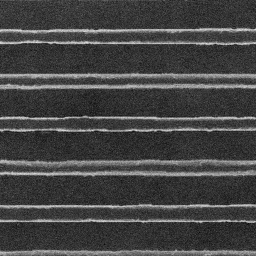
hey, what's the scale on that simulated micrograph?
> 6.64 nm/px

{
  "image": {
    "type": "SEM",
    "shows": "lines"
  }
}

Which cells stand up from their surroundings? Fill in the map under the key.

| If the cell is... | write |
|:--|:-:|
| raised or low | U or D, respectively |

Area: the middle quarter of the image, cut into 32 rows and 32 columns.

DDDDDDDDDDDDDDDDDDDDDDDDDDDDDDDD
DDDDDDDDDDDDDDDDDDDDDDDDDDDDDDDD
DDDDDDDDDDDDDDDDDDDDDDDDDDDDDDDD
UUUUUUUUUUUUUUUUUUUUUUUUUUUUUUUU
UUUUUUUUUUUUUUUUUUUUUUUUUUUUUUUU
UUUUUUUUUUUUUUUUUUUUUUUUUUUUUUUU
DDDDDDDDDDDDDDDDDDDDDDDDDDDDDDDD
DDDDDDDDDDDDDDDDDDDDDDDDDDDDDDDD
DDDDDDDDDDDDDDDDDDDDDDDDDDDDDDDD
DDDDDDDDDDDDDDDDDDDDDDDDDDDDDDDD
DDDDDDDDDDDDDDDDDDDDDDDDDDDDDDDD
DDDDDDDDDDDDDDDDDDDDDDDDDDDDDDDD
DDDDDDDDDDDDDDDDDDDDDDDDDDDDDDDD
UUUUUUUUUUUUUUUUUDDDDDDDDDDDDDDD
UUUUUUUUUUUUUUUUUUUUUUUUUUUUUUUU
UUUUUUUUUUUUUUUUUUUUUUUUUUUUUUUU
UUUUUUUUDUUUUUUUUDUUUUDDDUDDDDDD
DDDDDDDDDDDDDDDDDDDDDDDDDDDDDDDD
DDDDDDDDDDDDDDDDDDDDDDDDDDDDDDDD
DDDDDDDDDDDDDDDDDDDDDDDDDDDDDDDD
DDDDDDDDDDDDDDDDDDDDDDDDDDDDDDDD
DDDDDDDDDDDDDDDDDDDDDDDDDDDDDDDD
DDDDDDDDDDDDDDDDDDDDDDDDDDDDDDDD
DDDDDDDDDDDDDDDDDDDDDDDDDDDDDDDD
DDDDDDDDDDDDDDDDDDDDDDDDDDDDDDDD
UUUUUUUUUUUUUUUUUUUUUUUUUUUUUUUU
UUUUUUUUUUUUUUUUUUUUUUUUUUUUUUUU
DDDDDDDDDDDDDDDDDDDDDDDDDDUUUUUD
DDDDDDDDDDDDDDDDDDDDDDDDDDDDDDDD
DDDDDDDDDDDDDDDDDDDDDDDDDDDDDDDD
DDDDDDDDDDDDDDDDDDDDDDDDDDDDDDDD
DDDDDDDDDDDDDDDDDDDDDDDDDDDDDDDD